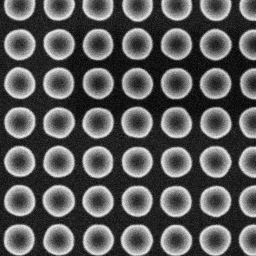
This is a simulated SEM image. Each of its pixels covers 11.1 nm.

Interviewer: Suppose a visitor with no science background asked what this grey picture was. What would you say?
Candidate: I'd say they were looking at an array of small figures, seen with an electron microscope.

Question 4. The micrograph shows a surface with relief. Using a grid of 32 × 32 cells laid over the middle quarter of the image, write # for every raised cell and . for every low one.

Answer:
................................
#......###.......###......####..
##...#######...######....######.
##...#######...#######...#######
##...#######...#######..########
##...#######...#######..########
##...#######...#######...#######
#.....#####.....#####....######.
........##.......###.......##...
................................
................................
#......###......####......####..
##...#######...######....######.
###..#######..########...#######
###..#######..########..########
###..#######..########..########
##...#######...######....#######
#.....#####.....#####.....#####.
................................
................................
................................
#.....#####.....#####.....####..
##...#######...######....######.
##...#######...#######..########
###..#######...#######..########
##...#######...#######...#######
##...#######...######....######.
#.....#####.....####......####..
................................
................................
........##......................
#.....#####.....#####....#####..